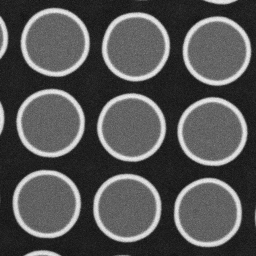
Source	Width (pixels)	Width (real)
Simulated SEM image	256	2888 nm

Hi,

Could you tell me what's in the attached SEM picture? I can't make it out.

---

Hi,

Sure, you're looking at an array of small figures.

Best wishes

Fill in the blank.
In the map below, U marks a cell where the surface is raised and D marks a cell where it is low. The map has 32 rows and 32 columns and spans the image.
DDDDDDDDDDDDDDDDDDDDDDDDDDDDDDDD
DDDDDUUUUDDDDDDDDDDDDDDDDDDDDDDD
DDDDUUUUUUDDDDUUUUUUDDDDDUUUUDDD
UDDUUUUUUUUDDUUUUUUUUDDDUUUUUUDD
UDDUUUUUUUUDDUUUUUUUUDDUUUUUUUUD
UDDUUUUUUUUDDUUUUUUUUDDUUUUUUUUD
UDDUUUUUUUUDDUUUUUUUUDDUUUUUUUUD
DDDUUUUUUUUDDUUUUUUUUDDUUUUUUUUD
DDDDUUUUUUDDDDUUUUUUDDDUUUUUUUUD
DDDDDDDUDDDDDDDUUUUDDDDDUUUUUUDD
DDDDDDDDDDDDDDDDDDDDDDDDDDUUDDDD
DDDDDUUUDDDDDDDDDDDDDDDDDDDDDDDD
DDDUUUUUUDDDDDUUUUUDDDDDDUUUDDDD
DDUUUUUUUUDDDUUUUUUUDDDDUUUUUUDD
UDUUUUUUUUUDUUUUUUUUDDDUUUUUUUDD
DDUUUUUUUUUDUUUUUUUUUDUUUUUUUUUD
DDUUUUUUUUDDUUUUUUUUUDUUUUUUUUUD
DDDUUUUUUUDDDUUUUUUUDDUUUUUUUUUD
DDDUUUUUUDDDDUUUUUUUDDDUUUUUUUDD
DDDDDUUDDDDDDDUUUUUDDDDDUUUUUUDD
DDDDDDDDDDDDDDDDDDDDDDDDDUUUDDDD
DDDDUUUDDDDDDDDDDDDDDDDDDDDDDDDD
DDDUUUUUUDDDDUUUUUDDDDDDDUUDDDDD
DDUUUUUUUUDDUUUUUUUDDDDUUUUUUDDD
DDUUUUUUUUDDUUUUUUUUDDUUUUUUUUDD
DDUUUUUUUUDDUUUUUUUUDDUUUUUUUUDD
DDUUUUUUUUDDUUUUUUUUDDUUUUUUUUDD
DDUUUUUUUUDDUUUUUUUUDDUUUUUUUUDD
DDDUUUUUUDDDDUUUUUUDDDUUUUUUUUDD
DDDDUUUDDDDDDUUUUUDDDDDUUUUUUDDD
DDDDDDDDDDDDDDDDDDDDDDDDUUUUDDDD
DDDDUUDDDDDDDDDDDDDDDDDDDDDDDDDD